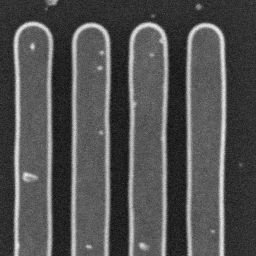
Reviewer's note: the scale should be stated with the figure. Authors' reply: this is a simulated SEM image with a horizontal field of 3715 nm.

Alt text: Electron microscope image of groups of lines, slits or small figures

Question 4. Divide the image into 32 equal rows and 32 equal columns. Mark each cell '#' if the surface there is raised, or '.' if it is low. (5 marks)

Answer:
................................
................................
................................
...##.....###....###.....##.....
..####...####....###....####....
..####...####....####...####....
..####...####...#####...####....
..####...####...#####...####....
..####...####...#####...####....
..####...####...#####...####....
..####...####...#####...####....
..####...####...#####...####....
..####...####....####...####....
..####...####....####...####....
..####...####....####...####....
..####...####....###....####....
..####...####....###....####....
..####...####....####...####....
..####...####....###....####....
..####...####....###....####....
..####...####...####....####....
..####...####...####....####....
..####...####...####....####....
..####...####...####....####....
..####...####...####....####....
..####...####...####....####....
..####...####...####....####....
..####...####...####....####....
..####...####...####....####....
..####...####...####....####....
..####...####...####....####....
..####...####...####....####....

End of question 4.